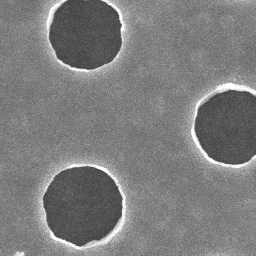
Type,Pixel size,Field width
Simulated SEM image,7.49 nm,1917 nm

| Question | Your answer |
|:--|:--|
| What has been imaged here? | holes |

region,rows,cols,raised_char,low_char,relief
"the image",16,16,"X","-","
XXXX---XXXXXXXXX
XXX-----XXXXXXXX
XXX-----XXXXXXXX
XXXX---XXXXXXXXX
XXXXXXXXXXXXXXXX
XXXXXXXXXXXXXXXX
XXXXXXXXXXXXX---
XXXXXXXXXXXX----
XXXXXXXXXXXX----
XXXXXXXXXXXXX---
XXXX--XXXXXXXXXX
XXX----XXXXXXXXX
XXX-----XXXXXXXX
XXX-----XXXXXXXX
XXX----XXXXXXXXX
XXXXXXXXXXXXXXXX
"